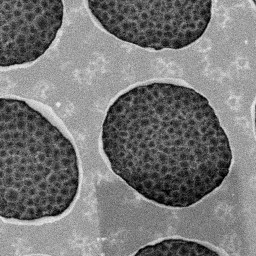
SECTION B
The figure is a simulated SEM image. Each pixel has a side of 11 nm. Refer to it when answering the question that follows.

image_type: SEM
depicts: holes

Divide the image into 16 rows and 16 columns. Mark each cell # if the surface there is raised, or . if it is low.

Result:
....##.......###
....##.......###
...#####....####
...#############
################
########....####
..#####......###
...####.......##
....##........##
.....##.......##
.....##.......##
.....###......##
.....####...####
....############
################
#########....###